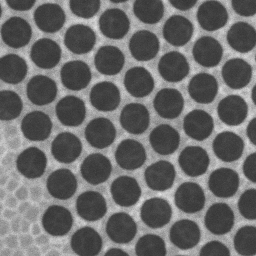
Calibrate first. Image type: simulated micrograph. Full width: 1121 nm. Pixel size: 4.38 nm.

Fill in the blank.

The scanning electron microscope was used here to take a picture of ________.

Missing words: a regular array of holes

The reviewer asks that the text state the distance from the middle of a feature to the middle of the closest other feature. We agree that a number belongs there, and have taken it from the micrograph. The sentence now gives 159 nm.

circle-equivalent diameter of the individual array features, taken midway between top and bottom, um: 0.138